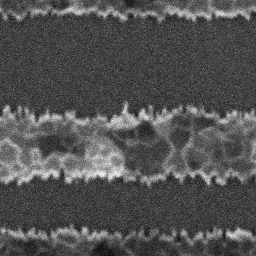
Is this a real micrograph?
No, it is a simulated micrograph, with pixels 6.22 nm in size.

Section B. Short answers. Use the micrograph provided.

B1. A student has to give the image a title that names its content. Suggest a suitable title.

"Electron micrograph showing one or a few lines or trenches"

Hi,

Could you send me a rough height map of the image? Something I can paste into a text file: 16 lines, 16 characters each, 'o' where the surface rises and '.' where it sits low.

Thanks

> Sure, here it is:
oooooooooooooooo
................
................
................
................
................
................
ooooo.oooooooooo
oooooooooooooooo
oooooooooooooooo
oooooooooooooooo
................
................
................
....o...........
oooooooooooooooo